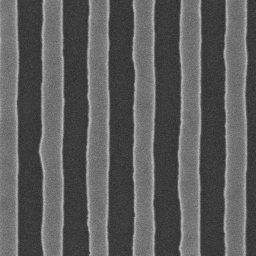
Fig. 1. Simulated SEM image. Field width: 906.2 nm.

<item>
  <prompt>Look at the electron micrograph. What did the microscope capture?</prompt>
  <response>lines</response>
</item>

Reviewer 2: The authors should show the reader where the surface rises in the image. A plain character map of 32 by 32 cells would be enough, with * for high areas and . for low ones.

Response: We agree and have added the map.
**...***...***...**....**...***.
**...***...***...**....**...***.
**....**...**....**....**...***.
**...***...**....**....**...***.
**...***...**....**....**...***.
**...***...***...**...***...***.
**...***...**....**...***...***.
**...***...**....**....**...***.
**...***...**....**....**...***.
**...***...**....**....**...***.
**...***...**....**....**...***.
**...***...***...**....**...***.
**...***...***...**....**...***.
**...***...***...**....**...***.
**...***...***...**....**...***.
**...***...***...**....**...***.
**...***...***...**....**...***.
**...***...***...**...***...***.
**...***...***...**...***...***.
**...***...***...**...***...***.
**...***...***...**...***...***.
**...***...**....**...***...***.
**....**...**....**...***...***.
**...***...**....**...***...***.
**...***...**....**...***...***.
**....**...**....**....**...***.
**...***...**....**....**...***.
**...***...**....**....**...***.
**...***...**....**....**...***.
**...***...**....**....**...***.
**...***...**....**....**...***.
**...***...**....**....**...***.